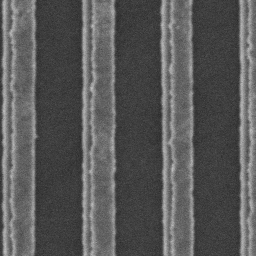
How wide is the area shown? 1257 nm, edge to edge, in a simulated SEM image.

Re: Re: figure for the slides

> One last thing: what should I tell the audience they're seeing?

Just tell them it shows lines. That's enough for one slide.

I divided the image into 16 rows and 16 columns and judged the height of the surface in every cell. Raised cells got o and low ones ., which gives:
oo...oo...oo...o
oo...oo...oo...o
oo...oo...oo...o
oo...oo...oo...o
oo...oo...oo...o
oo...oo...oo...o
oo...oo...oo...o
oo...oo...oo...o
oo...oo...oo...o
oo...oo...oo...o
oo...oo...oo...o
oo...oo...oo...o
oo...oo...oo...o
oo...oo...oo...o
oo...oo...oo...o
oo...oo...oo...o